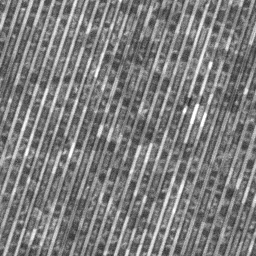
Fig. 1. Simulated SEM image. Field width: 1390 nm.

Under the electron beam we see parallel lines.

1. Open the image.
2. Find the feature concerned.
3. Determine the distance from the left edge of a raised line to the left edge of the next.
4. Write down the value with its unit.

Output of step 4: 57.3 nanometres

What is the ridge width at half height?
9.7 nm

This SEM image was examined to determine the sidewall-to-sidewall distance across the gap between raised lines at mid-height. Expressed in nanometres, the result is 47.8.